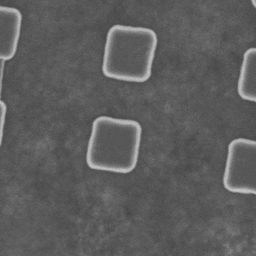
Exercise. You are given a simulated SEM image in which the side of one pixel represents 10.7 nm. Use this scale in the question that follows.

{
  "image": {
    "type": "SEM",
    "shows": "raised bodies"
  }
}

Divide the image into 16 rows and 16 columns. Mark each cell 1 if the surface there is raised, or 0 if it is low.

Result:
0000000000000000
1000000000000000
1000000111000000
1000000111000001
0000000110000001
0000000000000001
0000000000000000
0000001000000000
0000001110000000
0000001110000011
0000001100000011
0000000000000011
0000000000000000
0000000000000000
0000000000000000
0000000000000000